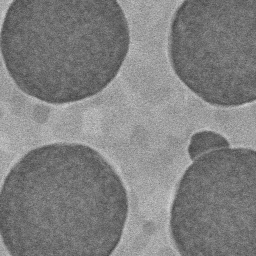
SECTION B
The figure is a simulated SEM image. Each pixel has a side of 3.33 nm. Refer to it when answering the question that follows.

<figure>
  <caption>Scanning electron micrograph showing holes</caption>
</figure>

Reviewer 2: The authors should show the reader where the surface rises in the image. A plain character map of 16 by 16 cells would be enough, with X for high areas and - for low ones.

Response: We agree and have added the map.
X-------XXX-----
--------XXX-----
--------XXX-----
--------XXX-----
-------XXXX-----
X-----XXXXXX----
XXXXXXXXXXXXX--X
XXXXXXXXXXXXXXXX
XXXXXXXXXXXX--XX
XX----XXXXXX----
X------XXXXX----
--------XXX-----
--------XXX-----
--------XXX-----
--------XXX-----
-------XXXX-----